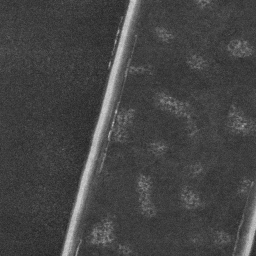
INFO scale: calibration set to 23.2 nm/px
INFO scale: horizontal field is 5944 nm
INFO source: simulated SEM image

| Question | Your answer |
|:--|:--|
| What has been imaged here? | one or a few lines or trenches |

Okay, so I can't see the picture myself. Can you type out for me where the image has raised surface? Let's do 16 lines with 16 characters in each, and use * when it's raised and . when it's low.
........********
........********
........********
.......*********
.......*********
.......*********
.......*********
......**********
......**********
......**********
.....***********
.....***********
.....***********
.....***********
....************
....************